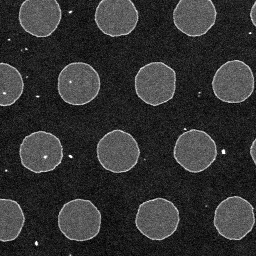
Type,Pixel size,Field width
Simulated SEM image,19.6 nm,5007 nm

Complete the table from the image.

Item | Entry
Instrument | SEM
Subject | a regular array of raised bodies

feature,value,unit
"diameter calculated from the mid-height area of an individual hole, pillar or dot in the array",820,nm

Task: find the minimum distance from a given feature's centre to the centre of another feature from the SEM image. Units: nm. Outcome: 1510